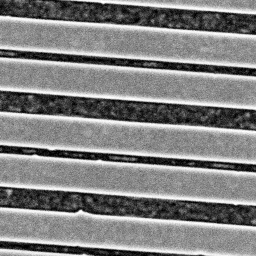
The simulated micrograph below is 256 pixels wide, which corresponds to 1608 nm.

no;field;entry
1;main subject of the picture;parallel lines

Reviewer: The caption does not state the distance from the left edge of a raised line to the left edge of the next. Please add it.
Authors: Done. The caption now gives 297 nanometres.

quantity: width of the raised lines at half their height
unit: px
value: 33